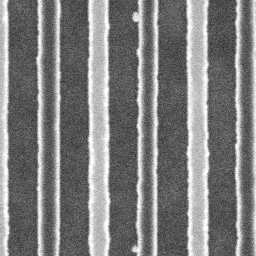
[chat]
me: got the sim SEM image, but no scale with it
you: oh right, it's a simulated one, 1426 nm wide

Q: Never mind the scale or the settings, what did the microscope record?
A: lines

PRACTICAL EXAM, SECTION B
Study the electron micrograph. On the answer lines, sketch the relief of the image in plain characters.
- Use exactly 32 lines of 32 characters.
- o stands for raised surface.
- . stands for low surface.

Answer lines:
o....oo....oo....ooo....oo....oo
o....oo....oo....ooo....oo....oo
o....oo....oo....ooo....oo....oo
o....oo....ooo...ooo....oo....oo
o....oo....oo....ooo....oo....oo
o....oo....oo....ooo....oo....oo
o....oo....oo....ooo....oo....oo
o....oo....oo....ooo....oo....oo
o....oo....oo....ooo....oo....oo
o....oo....oo....ooo....oo....oo
o....oo....oo....ooo....oo....oo
o....oo....oo....ooo....oo....oo
o....oo....oo....oo.....oo....oo
o....oo....oo....oo.....oo....oo
o....oo....oo....ooo....oo....oo
o....oo....oo....ooo....oo....oo
o....oo....oo....oo.....oo....oo
o....oo....oo....oo.....oo....oo
o....oo....oo....ooo....oo....oo
o....oo.....o....ooo....oo....oo
o....oo....oo....oo.....oo....oo
o....oo....oo....oo.....oo....oo
o....oo....oo....oo.....oo....oo
o....oo....oo....oo.....oo....oo
o....oo.....o....oo.....oo....oo
o....oo....ooo...oo.....oo....oo
o....oo....oo....oo.....oo....oo
o....oo....oo....oo.....oo....oo
o....oo....oo....oo.....oo....oo
o....oo....oo....oo.....oo....oo
o....oo....ooo...oo.....oo....oo
o....oo.....o....oo.....oo....oo